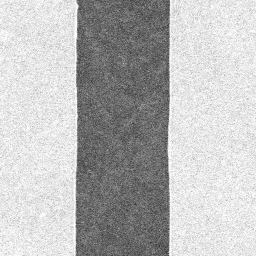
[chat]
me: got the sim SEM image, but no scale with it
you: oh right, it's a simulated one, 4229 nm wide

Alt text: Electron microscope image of one or a few lines or trenches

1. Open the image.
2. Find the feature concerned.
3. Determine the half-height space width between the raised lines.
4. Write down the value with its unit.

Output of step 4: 1550 nm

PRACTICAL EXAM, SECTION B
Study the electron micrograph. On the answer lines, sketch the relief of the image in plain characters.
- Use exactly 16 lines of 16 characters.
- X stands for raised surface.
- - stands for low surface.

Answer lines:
XXXXX------XXXXX
XXXXX------XXXXX
XXXXX------XXXXX
XXXXX------XXXXX
XXXXX------XXXXX
XXXXX------XXXXX
XXXXX------XXXXX
XXXXX------XXXXX
XXXXX------XXXXX
XXXXX------XXXXX
XXXXX------XXXXX
XXXXX------XXXXX
XXXXX------XXXXX
XXXXX------XXXXX
XXXXX------XXXXX
XXXXX------XXXXX